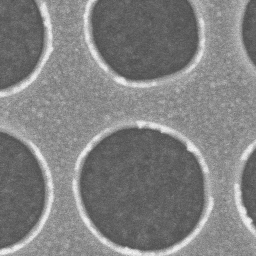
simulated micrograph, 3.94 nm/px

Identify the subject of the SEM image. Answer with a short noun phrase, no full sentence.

holes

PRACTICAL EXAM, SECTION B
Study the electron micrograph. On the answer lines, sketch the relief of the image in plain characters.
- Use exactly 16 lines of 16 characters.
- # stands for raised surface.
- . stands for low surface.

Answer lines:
..####......###.
...###......###.
...###......###.
...###......###.
..#####....#####
.###############
################
################
.######....#####
..####......####
...##........##.
...##........##.
...##........##.
...##........###
..####......####
########...#####